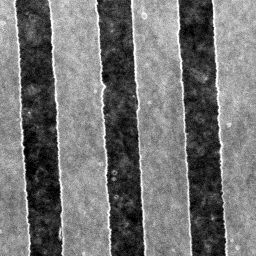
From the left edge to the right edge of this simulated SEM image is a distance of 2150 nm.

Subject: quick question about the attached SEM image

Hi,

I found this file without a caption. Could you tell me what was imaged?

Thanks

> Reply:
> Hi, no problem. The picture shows one or a few lines or trenches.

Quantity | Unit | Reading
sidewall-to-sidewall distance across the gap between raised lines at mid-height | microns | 0.287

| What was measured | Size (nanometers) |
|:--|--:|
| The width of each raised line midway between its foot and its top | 392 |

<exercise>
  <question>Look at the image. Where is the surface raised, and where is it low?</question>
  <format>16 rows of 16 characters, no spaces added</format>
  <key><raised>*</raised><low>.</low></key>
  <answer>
*..***..***..***
*..***..***..***
*..***..***..***
*..***..***..***
*..***..***...**
*..***...**...**
*...**...**...**
*...**...***..**
*...***..***..**
*...***..***..**
**..***..***..**
**..***..***..**
**..***..***..**
**..***..***..**
**..***..***..**
**..***..***..**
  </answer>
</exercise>